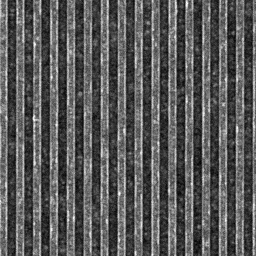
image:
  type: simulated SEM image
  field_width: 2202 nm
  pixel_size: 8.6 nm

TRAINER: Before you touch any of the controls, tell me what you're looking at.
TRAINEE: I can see parallel lines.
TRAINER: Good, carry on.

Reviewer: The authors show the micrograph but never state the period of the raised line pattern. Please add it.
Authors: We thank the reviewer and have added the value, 145 nm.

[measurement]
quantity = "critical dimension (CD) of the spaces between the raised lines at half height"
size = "87.1 nm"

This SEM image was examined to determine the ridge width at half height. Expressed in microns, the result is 0.0613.